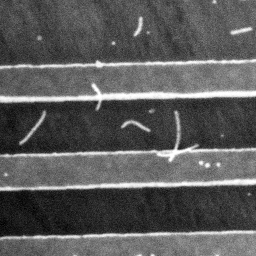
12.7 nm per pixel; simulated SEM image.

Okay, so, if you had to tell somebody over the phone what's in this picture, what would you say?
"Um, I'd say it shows lines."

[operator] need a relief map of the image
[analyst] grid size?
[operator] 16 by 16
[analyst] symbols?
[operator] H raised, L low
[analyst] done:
LLLLLLLLLLLLLLLL
LLLLLLLLLLLLLLLL
LLLLLLLLLLLLLLLL
LLLLLLLLLLLLLLLL
HHHHHHHHHHHHHHHH
HHHHHHHHHHHHHHHH
LLLLLLLLLLLLLLLL
LLLLLLLLLLLLLLLL
LLLLLLLLLLLLLLLL
LLLLLLLHHHHHHHHH
HHHHHHHHHHHHHHHH
HHHHHHHHHHHHHLLL
LLLLLLLLLLLLLLLL
LLLLLLLLLLLLLLLL
LLLLLLLLLLLLLLHH
HHHHHHHHHHHHHHHH